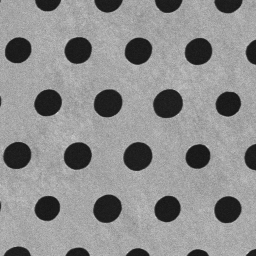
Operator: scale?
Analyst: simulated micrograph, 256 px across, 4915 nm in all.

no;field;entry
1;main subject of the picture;a regular array of holes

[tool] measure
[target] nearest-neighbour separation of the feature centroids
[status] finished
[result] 1150 nm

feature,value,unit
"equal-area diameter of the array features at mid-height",515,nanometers